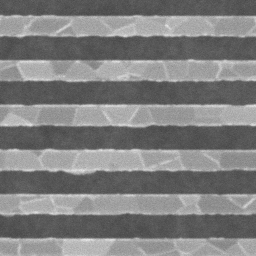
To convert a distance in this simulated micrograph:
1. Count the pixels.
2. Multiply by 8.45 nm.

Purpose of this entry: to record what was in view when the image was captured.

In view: lines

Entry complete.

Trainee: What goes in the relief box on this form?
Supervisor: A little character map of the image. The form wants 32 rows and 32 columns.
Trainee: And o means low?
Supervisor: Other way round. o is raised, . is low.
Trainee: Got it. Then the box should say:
................................
................................
oooooooooooooooooooooooooooooooo
oooooooooooooooooooooooooooooooo
..............................o.
................................
................................
................................
oooooooooooooooooooooooooooooooo
oooooooooooooooooooooooooooooooo
................................
................................
................................
oooooooooooooooooooooooooooooooo
oooooooooooooooooooooooooooooooo
oooooooooooooooooooooooooooooooo
................................
................................
................................
oooooooooooooooooooooooooooooooo
oooooooooooooooooooooooooooooooo
................................
................................
................................
oooooooooooooooooooooooooooooooo
oooooooooooooooooooooooooooooooo
oooooooooooooooooooooooooooooooo
................................
................................
................................
oooooooooooooooooooooooooooooooo
oooooooooooooooooooooooooooooooo